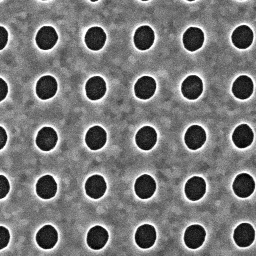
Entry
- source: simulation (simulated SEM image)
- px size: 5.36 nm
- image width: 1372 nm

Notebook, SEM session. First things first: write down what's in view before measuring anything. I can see a regular array of holes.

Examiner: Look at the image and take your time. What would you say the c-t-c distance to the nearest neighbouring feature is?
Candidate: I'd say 259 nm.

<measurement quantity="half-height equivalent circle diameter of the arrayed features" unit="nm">129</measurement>